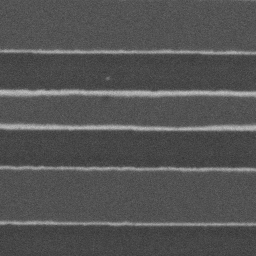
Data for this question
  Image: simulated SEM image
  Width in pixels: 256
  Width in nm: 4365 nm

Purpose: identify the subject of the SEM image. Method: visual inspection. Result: lines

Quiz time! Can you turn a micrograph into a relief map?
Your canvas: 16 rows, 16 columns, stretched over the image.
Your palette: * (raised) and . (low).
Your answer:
****************
****************
****************
................
................
................
****************
****************
................
................
*********.......
****************
****************
****************
................
................